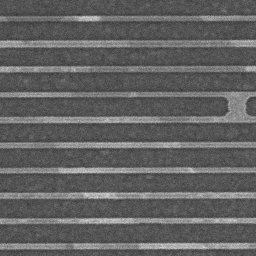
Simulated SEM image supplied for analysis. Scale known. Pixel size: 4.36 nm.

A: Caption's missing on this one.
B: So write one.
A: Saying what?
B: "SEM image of parallel lines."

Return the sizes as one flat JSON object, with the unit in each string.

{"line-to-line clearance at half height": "89.3 nanometres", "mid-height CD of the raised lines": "20.1 nm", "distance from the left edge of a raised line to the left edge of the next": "110 nanometers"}